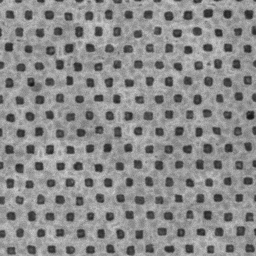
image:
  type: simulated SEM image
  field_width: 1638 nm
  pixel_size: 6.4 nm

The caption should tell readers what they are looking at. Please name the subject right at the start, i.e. a regular array of holes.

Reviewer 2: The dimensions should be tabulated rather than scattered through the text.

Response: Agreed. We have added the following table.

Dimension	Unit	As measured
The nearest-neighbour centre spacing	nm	116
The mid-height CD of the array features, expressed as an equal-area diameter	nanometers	62.9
